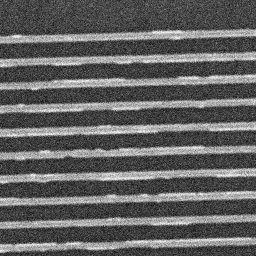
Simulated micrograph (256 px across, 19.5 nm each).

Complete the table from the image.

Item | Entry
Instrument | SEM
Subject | parallel lines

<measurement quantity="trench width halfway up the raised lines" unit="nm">346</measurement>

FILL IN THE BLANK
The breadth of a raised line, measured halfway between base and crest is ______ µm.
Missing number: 0.107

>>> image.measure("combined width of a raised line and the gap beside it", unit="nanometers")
452